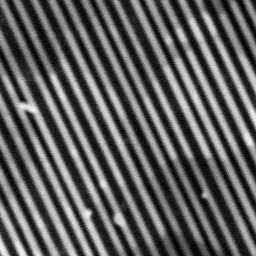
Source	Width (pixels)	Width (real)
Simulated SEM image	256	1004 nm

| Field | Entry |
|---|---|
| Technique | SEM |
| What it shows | parallel lines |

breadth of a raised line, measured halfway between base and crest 5.87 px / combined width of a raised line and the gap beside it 58.4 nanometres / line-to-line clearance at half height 36.7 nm